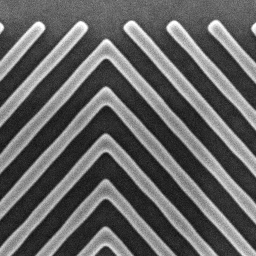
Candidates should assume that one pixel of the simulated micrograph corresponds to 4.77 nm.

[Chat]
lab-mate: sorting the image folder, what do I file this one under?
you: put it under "groups of lines, slits or small figures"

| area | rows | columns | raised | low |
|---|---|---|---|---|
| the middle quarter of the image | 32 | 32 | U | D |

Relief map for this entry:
DDDDUUUUDDDDDUUUUDDDDDDUUUUUDDDD
DDDUUUUDDDDDDDUUUUDDDDDDUUUUDDDD
DDUUUUDDDDDDDDDUUUUDDDDDDUUUUUDD
DUUUUUDDDDDDDDDDUUUUDDDDDDUUUUDD
DUUUUDDDDDDDDDDDUUUUDDDDDDDUUUUD
UUUUDDDDDDDDDDDDDUUUUDDDDDDDUUUU
UUUDDDDDDUUDDDDDDDUUUUDDDDDDUUUU
UUDDDDDDUUUUUDDDDDDUUUUDDDDDDUUU
UDDDDDDUUUUUUUDDDDDDUUUUDDDDDDUU
DDDDDDUUUUUUUUDDDDDDDUUUUDDDDDDU
DDDDDDUUUUDUUUUDDDDDDDUUUUDDDDDD
DDDDDUUUUDDDUUUUDDDDDDDUUUUDDDDD
DDDUUUUUDDDDDUUUUDDDDDDDUUUUDDDD
DDDUUUUDDDDDDDUUUUDDDDDDUUUUUDDD
DDUUUUDDDDDDDDDUUUUDDDDDDUUUUUDD
DUUUUUDDDDDDDDDDUUUUDDDDDDUUUUDD
UUUUUDDDDDDDDDDDUUUUUDDDDDDUUUUD
UUUDDDDDDDUDDDDDDDUUUUDDDDDDUUUU
UUDDDDDDDUUUDDDDDDUUUUUDDDDDDUUU
UDDDDDDDUUUUUDDDDDDUUUUUDDDDDDUU
UDDDDDDUUUUUUUDDDDDDUUUUUDDDDDDU
DDDDDDUUUUUUUUUDDDDDDUUUUDDDDDDU
DDDDDUUUUDDUUUUUDDDDDDUUUUDDDDDD
DDDDUUUUDDDDUUUUUDDDDDDUUUUDDDDD
DDDUUUUUDDDDDUUUUUDDDDDDUUUUDDDD
DDDUUUUDDDDDDDUUUUDDDDDDDUUUUDDD
DDUUUUDDDDDDDDDUUUUDDDDDDDUUUUDD
DUUUUDDDDDDDDDDDUUUUDDDDDDDUUUUD
UUUUDDDDDDDDDDDDDUUUUDDDDDDUUUUU
UUUDDDDDDUUDDDDDDDUUUUDDDDDDUUUU
UUDDDDDDDUUUDDDDDDDUUUUDDDDDDUUU
UDDDDDDDUUUUUDDDDDDUUUUUDDDDDDUU